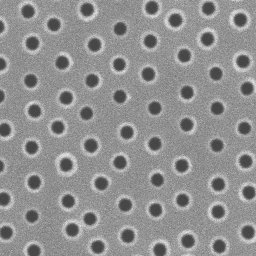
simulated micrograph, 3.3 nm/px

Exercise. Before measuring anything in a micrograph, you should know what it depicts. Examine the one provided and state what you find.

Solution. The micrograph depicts a regular array of holes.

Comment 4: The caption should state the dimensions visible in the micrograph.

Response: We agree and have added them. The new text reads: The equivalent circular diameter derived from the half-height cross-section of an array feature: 43 nanometers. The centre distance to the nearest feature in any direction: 100 nm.